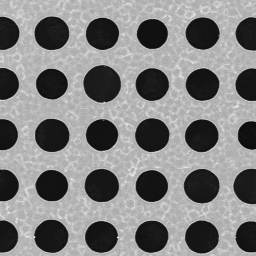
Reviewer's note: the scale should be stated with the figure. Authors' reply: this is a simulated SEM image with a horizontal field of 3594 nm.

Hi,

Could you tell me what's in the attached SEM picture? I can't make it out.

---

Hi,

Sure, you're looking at a regular array of holes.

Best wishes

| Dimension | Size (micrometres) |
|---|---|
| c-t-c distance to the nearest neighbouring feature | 0.703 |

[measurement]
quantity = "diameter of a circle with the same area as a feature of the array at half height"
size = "463 nanometres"